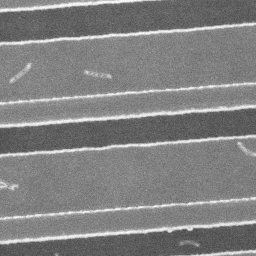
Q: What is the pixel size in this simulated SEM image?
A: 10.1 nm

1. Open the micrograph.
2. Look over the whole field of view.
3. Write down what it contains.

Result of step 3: lines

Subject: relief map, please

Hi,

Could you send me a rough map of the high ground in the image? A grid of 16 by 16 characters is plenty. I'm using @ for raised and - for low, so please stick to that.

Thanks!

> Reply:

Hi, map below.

@@@-------------
----------------
---@@@@@@@@@@@@@
@@@@@@@@@@@@@@@@
@@@@@@@@@@@@@@@@
@@@@@@@@@@@@@@@@
@@@@@@@@@@@@@@@@
@@@@@@----------
----------------
---@@@@@@@@@@@@@
@@@@@@@@@@@@@@@@
@@@@@@@@@@@@@@@@
@@@@@@@@@@@@@@@@
@@@@@@@@@@@@@@@@
@@@@@@@@--------
----------------